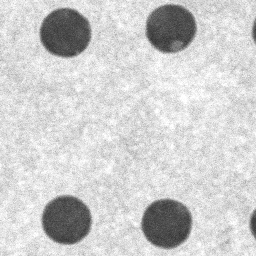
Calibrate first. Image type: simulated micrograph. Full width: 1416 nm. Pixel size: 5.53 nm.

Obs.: holes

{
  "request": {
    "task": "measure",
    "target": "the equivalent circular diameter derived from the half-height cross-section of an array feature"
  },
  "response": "50.1 pixels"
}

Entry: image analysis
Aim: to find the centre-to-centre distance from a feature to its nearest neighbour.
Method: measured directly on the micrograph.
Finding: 569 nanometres